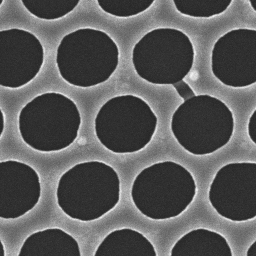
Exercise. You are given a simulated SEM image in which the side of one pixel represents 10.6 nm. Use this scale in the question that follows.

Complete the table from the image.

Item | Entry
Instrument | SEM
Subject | holes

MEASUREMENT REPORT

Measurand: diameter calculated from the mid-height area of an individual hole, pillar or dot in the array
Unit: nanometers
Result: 640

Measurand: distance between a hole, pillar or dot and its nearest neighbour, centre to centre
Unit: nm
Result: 788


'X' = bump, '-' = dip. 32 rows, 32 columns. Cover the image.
XXX-------XX-------XXX-------XX-
XXXX-----XXXX-----XXXXX-----XXXX
XXXXXXXXXXXXXXXXXXXXXXXXXXXXXXXX
XXXXXXXXXXXXXXXXXXXX-XXXXXXXXX-X
----XXXX-----XXXXX-----XXXXX----
-----XX-------XXX-------XXX-----
------X--------XX-------XXX-----
-----XX--------XX-------XX------
-----XX-------XXX-------XX------
-----XXX------XXXX-----XXXX-----
---XXXXXX---XXXXXXXX---XXXXX---X
XXXXXXXXXXXXXXXXXXXXXX--XXXXXXXX
XXXX-----XXXXX----XXXXX----XXXXX
XXX-------XXX------XXX-------XXX
XX--------XX-------XXX-------XX-
XX--------XX--------X--------XX-
XXX-------XX-------XXX-------XX-
XXX------XXX-------XXX-------XXX
XXXX----XXXXX-----XXXXX-----XXXX
XXXXXXXXXXXXXXXXXXXXXXXXXXXXXXXX
---XXXXXXX---XXXXXX---XXXXXXX---
----XXXX-------XXX------XXX-----
-----XXX-------XX-------XXX-----
-----XX--------X--------XX------
-----XX--------X--------XX------
-----XX--------XX-------XX------
---XXXXX-----XXXXX-----XXXX-----
XXXXXXXXXX--XXXXXXXXXXXXXXXXX--X
XXXXXXXXXXXXXXXXXXXXXXXXXXXXXXXX
XXXX-----XXXX-----XXXXX-----XXXX
XXX-------XXX------XXX------XXXX
XX--------XX-------XX--------XX-